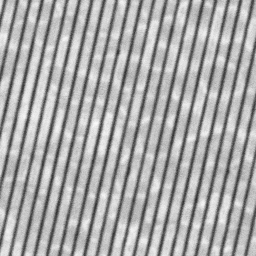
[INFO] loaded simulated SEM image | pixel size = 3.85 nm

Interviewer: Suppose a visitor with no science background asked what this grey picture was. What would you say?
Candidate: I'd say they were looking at parallel lines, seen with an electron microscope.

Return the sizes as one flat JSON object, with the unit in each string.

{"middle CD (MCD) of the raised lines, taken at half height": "36.2 nanometers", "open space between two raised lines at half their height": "0.0099 micrometres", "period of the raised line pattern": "0.0466 microns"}